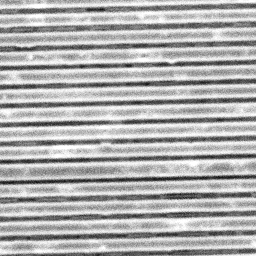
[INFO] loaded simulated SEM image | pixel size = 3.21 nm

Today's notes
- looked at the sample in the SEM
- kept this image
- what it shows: parallel lines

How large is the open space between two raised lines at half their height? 19.7 nm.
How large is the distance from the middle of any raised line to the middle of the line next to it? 0.0607 micrometres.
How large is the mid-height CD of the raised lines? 0.0389 micrometres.